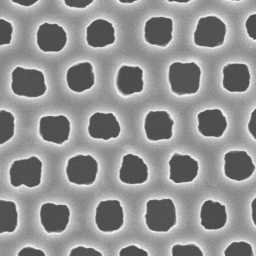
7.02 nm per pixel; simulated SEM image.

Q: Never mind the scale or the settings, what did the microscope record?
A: a regular array of holes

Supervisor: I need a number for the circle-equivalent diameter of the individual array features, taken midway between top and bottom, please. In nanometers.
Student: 211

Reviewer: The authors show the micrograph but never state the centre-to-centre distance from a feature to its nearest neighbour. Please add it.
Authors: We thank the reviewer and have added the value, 0.354 microns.